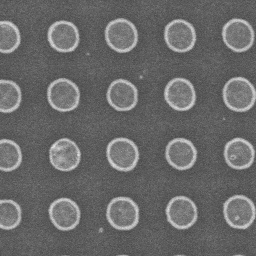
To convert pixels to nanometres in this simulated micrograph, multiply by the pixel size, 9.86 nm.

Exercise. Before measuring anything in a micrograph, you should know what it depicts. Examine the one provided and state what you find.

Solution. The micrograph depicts a regular array of raised bodies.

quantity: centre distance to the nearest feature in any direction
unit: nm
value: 572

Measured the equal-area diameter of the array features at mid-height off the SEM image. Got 0.296 microns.